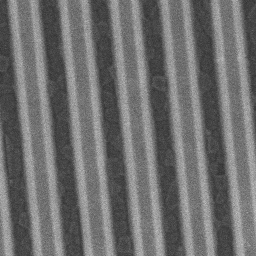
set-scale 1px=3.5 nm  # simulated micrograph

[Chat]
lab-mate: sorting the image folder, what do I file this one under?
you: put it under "parallel lines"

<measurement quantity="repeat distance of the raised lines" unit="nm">176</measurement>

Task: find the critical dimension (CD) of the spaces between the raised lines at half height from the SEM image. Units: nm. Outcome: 98.1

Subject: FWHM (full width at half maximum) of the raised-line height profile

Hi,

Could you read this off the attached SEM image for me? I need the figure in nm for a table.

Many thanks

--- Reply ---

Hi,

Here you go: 78.5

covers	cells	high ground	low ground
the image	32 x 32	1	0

00110000111000111000111000011100
00111000111000111000011000011100
00111000111000111000011100011100
00111000111000011000011100011100
00111000111000011000011100011100
00111000111000011000011100011100
00111000111000011100011100011100
00111000011000011100011100011100
00111000011100011100011100001100
00111000011100011100011100001110
00011000011100011100011100001110
00011100011100011100001100001110
00011100011100011100001110001110
00011100011100001100001110001110
00011100011100001100001110001110
00011100011100001100001110001110
00011100011100001110001110001110
00011100001100001110001110001110
00011100001110001110001110000110
00011100001110001110001110000111
00001100001110001110001110000111
00001110001110001110000110000111
00001110001110001110000111000111
00001110001110000110000111000111
10001110001110000110000111000111
10001110001110000111000111000111
10001110001110000111000111000111
10001110000110000111000111000111
10001110000111000111000111000011
10001110000111000111000111000011
10000110000111000111000011000011
10000111000111000111000011000011